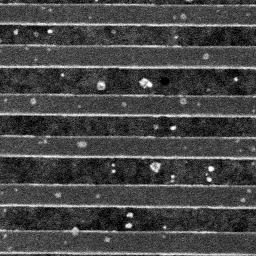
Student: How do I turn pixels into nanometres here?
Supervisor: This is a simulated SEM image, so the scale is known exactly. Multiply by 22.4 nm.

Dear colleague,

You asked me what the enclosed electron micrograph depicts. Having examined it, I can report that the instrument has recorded lines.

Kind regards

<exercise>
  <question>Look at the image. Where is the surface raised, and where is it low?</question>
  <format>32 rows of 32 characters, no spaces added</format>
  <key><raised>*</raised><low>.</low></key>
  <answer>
****............................
********************************
********************************
................................
................................
................................
********************************
********************************
................................
................................
................................
................................
********************************
********************************
........................********
................................
................................
********************************
********************************
********************************
................................
................................
................................
********************************
********************************
********************************
................................
................................
................................
********************************
********************************
********************************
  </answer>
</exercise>